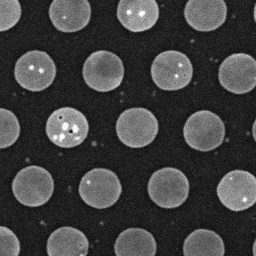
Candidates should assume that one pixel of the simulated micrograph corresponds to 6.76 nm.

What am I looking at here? a regular array of raised bodies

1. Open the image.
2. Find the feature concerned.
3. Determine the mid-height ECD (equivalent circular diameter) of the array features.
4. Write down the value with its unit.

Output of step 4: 274 nm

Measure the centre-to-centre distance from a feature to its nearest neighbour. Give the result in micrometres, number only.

0.45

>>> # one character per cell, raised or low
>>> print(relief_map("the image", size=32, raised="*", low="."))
**....*****....*****...*****....
***...*****....*****...*****....
**....*****....*****...*****....
*......***......***.....***.....
................................
................................
....*.......**.......*..........
..****.....****....*****....****
..*****...*****....*****...*****
..*****...*****....*****...*****
...***.....****.....***.....****
.............................**.
................................
................................
**....****.....****.....***.....
**....*****....*****...*****....
**....*****....*****...*****....
**....****.....****....*****....
........................***.....
................................
................................
..****.....***......***......**.
..*****...*****....****.....****
..*****...*****....*****...*****
..****....*****....****....*****
...**......***......***.....****
................................
................................
*.......*.......................
**....*****....****.....***.....
**....*****...*****....*****....
**....*****...*****....*****....